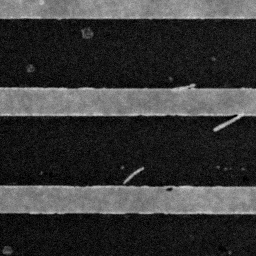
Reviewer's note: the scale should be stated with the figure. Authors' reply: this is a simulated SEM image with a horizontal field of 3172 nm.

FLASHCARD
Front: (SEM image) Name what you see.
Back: lines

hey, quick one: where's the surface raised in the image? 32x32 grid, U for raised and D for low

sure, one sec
UUUUUUUUUUUUUUUUUUUUUUUUUUUUUUUU
UUUUUUUUUUUUUUUUUUUUUUUUUUUUUUUU
DDDDDDDDDDDDDDDDDDDDDDDDDDDDDDDD
DDDDDDDDDDDDDDDDDDDDDDDDDDDDDDDD
DDDDDDDDDDDDDDDDDDDDDDDDDDDDDDDD
DDDDDDDDDDDDDDDDDDDDDDDDDDDDDDDD
DDDDDDDDDDDDDDDDDDDDDDDDDDDDDDDD
DDDDDDDDDDDDDDDDDDDDDDDDDDDDDDDD
DDDDDDDDDDDDDDDDDDDDDDDDDDDDDDDD
DDDDDDDDDDDDDDDDDDDDDDDDDDDDDDDD
DDDDDDDDDDDDDDDDDDDDDDDDDDDDDDDD
UUUUUUUUUUUUUUUUUUUUUUUUUUUUUUUU
UUUUUUUUUUUUUUUUUUUUUUUUUUUUUUUU
UUUUUUUUUUUUUUUUUUUUUUUUUUUUUUUU
DDDDDDDDDDDDDDDDDDDDDDDDDDDDDUUD
DDDDDDDDDDDDDDDDDDDDDDDDDDDDDDDD
DDDDDDDDDDDDDDDDDDDDDDDDDDDDDDDD
DDDDDDDDDDDDDDDDDDDDDDDDDDDDDDDD
DDDDDDDDDDDDDDDDDDDDDDDDDDDDDDDD
DDDDDDDDDDDDDDDDDDDDDDDDDDDDDDDD
DDDDDDDDDDDDDDDDDDDDDDDDDDDDDDDD
DDDDDDDDDDDDDDDDDDDDDDDDDDDDDDDD
DDDDDDDDDDDDDDDDDDDDDDDDDDDDDDDD
UUUUUUUUUUUUUUUUUUUUUUUUUUUUUUUU
UUUUUUUUUUUUUUUUUUUUUUUUUUUUUUUU
UUUUUUUUUUUUUUUUUUUUUUUUUUUUUUUU
UUUUUUUUUUUUUUUUUUUUUUUUUUUUUUUU
DDDDDDDDDDDDDDDDDDDDDDDDDDDDDDDD
DDDDDDDDDDDDDDDDDDDDDDDDDDDDDDDD
DDDDDDDDDDDDDDDDDDDDDDDDDDDDDDDD
DDDDDDDDDDDDDDDDDDDDDDDDDDDDDDDD
DDDDDDDDDDDDDDDDDDDDDDDDDDDDDDDD